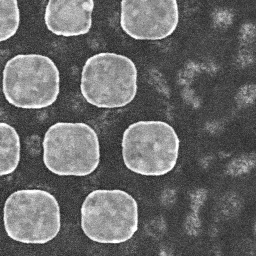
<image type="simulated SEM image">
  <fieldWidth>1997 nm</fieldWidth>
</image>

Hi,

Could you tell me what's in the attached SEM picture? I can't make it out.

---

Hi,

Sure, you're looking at raised bodies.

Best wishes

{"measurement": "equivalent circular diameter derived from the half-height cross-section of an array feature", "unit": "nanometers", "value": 438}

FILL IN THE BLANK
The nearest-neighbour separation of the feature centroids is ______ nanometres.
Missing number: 607